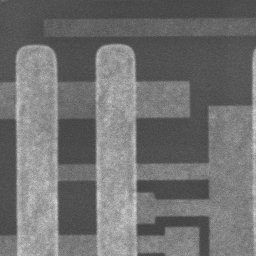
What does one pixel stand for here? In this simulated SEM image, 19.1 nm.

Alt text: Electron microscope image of wiring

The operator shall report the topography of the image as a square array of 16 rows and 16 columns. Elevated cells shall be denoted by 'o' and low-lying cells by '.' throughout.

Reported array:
................
................
................
.oo...oo........
.ooo..oo........
.ooo..oo........
.ooo..oo........
.ooo..oo........
.ooo..oo........
.ooo..oo........
.ooo..oo........
.ooo..oo........
.ooo..oo........
.ooo..oo........
.ooo..oo........
.ooo..ooo.......